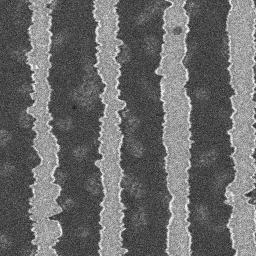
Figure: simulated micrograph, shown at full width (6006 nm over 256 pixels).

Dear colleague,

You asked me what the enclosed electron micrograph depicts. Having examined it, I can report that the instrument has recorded one or a few lines or trenches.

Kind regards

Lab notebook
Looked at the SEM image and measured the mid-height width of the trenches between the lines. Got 1080 nm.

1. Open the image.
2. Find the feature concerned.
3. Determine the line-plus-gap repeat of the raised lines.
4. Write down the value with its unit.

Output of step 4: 1.56 microns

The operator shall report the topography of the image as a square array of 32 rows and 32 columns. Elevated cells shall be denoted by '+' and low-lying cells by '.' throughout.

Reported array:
....++......++.......++......+++
....++......++.......++......+++
....++......+++.....++++....++++
....++......+++......++.....++++
....++......++.......++......+++
....++......+++......++......+++
....++......+++.....+++......+++
....++......++......+++......+++
....++......+++.....+++......+++
....++.......++.....+++......+++
....++.......++.....+++......+++
....++.......++.....+++......+++
....++.......++.....++++.....+++
....++.......++......+++.....+++
....++.......++......+++.....+++
....++.......++......+++.....+++
....++.......++.....++++.....+++
....+++......++.....++++.....+++
....+++......++......+++.....+++
.....++......++......+++.....++.
.....++.....+++......+++.....+++
....+++......++......++.......++
....+++......++......++......+++
....+++......++......+++....++++
....+++......++.......+.....+++.
....+++......++......++......++.
....+++......++......++......+++
....++.......++......++......+++
....++++.....++......++......+++
....+++......++......+++.....+++
....+++.....+++......+++.....+++
.....++......+++.....+++......++